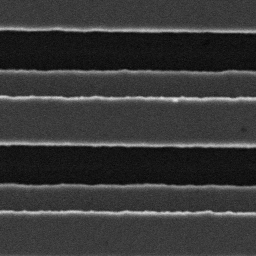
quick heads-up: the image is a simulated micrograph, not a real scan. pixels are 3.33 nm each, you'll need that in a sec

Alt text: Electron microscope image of lines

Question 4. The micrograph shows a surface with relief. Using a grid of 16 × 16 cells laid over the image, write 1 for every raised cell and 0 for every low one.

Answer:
1111111111111111
1111111111111111
0000000000000000
0000000000000000
1111111111111111
1111111111111111
1111111111111111
1111111111111111
1111111111111111
0000000000000000
0000000000000000
0000000000000000
1111111111111111
1111111111111111
1111111111111111
1111111111111111